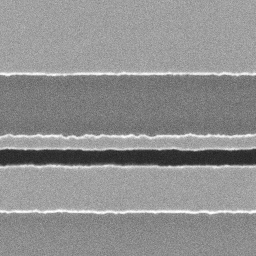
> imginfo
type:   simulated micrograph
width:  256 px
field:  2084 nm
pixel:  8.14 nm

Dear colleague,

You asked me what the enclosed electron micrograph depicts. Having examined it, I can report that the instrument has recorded lines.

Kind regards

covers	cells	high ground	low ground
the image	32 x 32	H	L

HHHHHHHHHHHHHHHHHHHHHHHHHHHHHHHH
HHHHHHHHHHHHHHHHHHHHHHHHHHHHHHHH
HHHHHHHHHHHHHHHHHHHHHHHHHHHHHHHH
HHHHHHHHHHHHHHHHHHHHHHHHHHHHHHHH
HHHHHHHHHHHHHHHHHHHHHHHHHHHHHHHH
HHHHHHHHHHHHHHHHHHHHHHHHHHHHHHHH
HHHHHHHHHHHHHHHHHHHHHHHHHHHHHHHH
HHHHHHHHHHHHHHHHHHHHHHHHHHHHHHHH
HHHHHHHHHHHHHHHHHHHHHHHHHHHHHHHH
LLLLLLLLLLLLLLLLLLLLLLLLLLLLLLLL
LLLLLLLLLLLLLLLLLLLLLLLLLLLLLLLL
LLLLLLLLLLLLLLLLLLLLLLLLLLLLLLLL
LLLLLLLLLLLLLLLLLLLLLLLLLLLLLLLL
LLLLLLLLLLLLLLLLLLLLLLLLLLLLLLLL
LLLLLLLLLLLLLLLLLLLLLLLLLLLLLLLL
LLLLLLLLLLLLLLLLLLLLLLLLLLLLLLLL
LLLLLLLLLLLLLLLLLLLLLLLLLLLLLLLL
HHHHHHHHHHHHHHHHHHHHHHHHHHHHHHHH
HHHHHHHHHHHHHHHHHHHHHHHHHHHHHHHH
LLLLLLLLLLLLLLLLLLLLLLLLLLLLLLLL
LLLLLLLLLLLLLLLLLLLLLLLLLLLLLLLL
HHHHHHHHHHHHHHHHHHHHHHHHHHHHHHHH
HHHHHHHHHHHHHHHHHHHHHHHHHHHHHHHH
HHHHHHHHHHHHHHHHHHHHHHHHHHHHHHHH
HHHHHHHHHHHHHHHHHHHHHHHHHHHHHHHH
HHHHHHHHHHHHHHHHHHHHHHHHHHHHHHHH
HHHHHHHLHHHHHHHHHHHHHHHHHHHHHHHH
LLLLLLLLLLLLLLLLLLLLLLLLLLLLLLLL
LLLLLLLLLLLLLLLLLLLLLLLLLLLLLLLL
LLLLLLLLLLLLLLLLLLLLLLLLLLLLLLLL
LLLLLLLLLLLLLLLLLLLLLLLLLLLLLLLL
LLLLLLLLLLLLLLLLLLLLLLLLLLLLLLLL